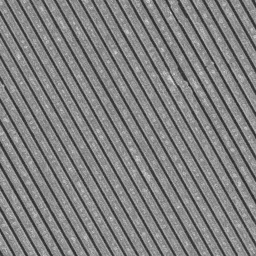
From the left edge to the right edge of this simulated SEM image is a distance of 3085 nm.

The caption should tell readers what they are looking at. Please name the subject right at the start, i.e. parallel lines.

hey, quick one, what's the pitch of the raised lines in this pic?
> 130 nm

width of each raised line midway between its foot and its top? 94.4 nm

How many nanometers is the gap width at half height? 35.4